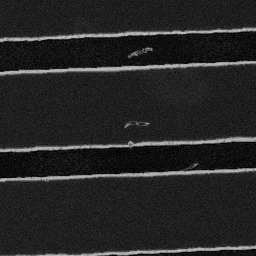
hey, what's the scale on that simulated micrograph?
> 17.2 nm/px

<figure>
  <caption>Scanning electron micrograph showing lines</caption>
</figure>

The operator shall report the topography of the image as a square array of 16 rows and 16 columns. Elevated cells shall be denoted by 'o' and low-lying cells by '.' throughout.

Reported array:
oooooooooooooooo
oooooooooooooooo
o...............
................
.ooooooooooooooo
oooooooooooooooo
oooooooooooooooo
oooooooooooooooo
oooooooooooooooo
................
................
oooooooooooooooo
oooooooooooooooo
oooooooooooooooo
oooooooooooooooo
oooooooooooooooo